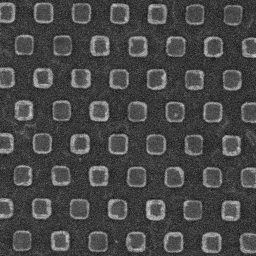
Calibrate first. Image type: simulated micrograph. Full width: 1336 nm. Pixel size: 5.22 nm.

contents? a regular array of raised bodies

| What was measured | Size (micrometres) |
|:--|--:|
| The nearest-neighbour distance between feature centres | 0.195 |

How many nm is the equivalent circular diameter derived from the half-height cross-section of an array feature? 104